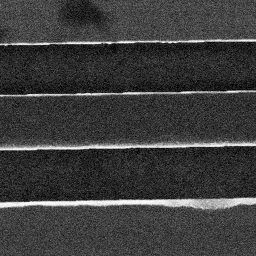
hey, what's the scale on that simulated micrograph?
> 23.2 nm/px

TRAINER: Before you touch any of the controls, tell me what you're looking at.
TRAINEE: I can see lines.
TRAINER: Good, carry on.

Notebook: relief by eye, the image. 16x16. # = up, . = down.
################
################
################
................
................
................
################
################
################
................
................
................
................
################
################
################